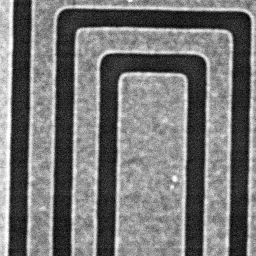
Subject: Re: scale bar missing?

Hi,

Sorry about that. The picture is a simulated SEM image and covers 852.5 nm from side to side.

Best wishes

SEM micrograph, groups of lines, slits or small figures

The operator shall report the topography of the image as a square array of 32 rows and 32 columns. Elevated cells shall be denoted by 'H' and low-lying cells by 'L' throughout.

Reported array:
HLLLHHHHHHHHHHHHHHHHHHHHHHHHHHHH
HLLLHHHLLLLLLLLLLLLLLLLLLLLLLLLH
HLLLHHHLLLLLLLLLLLLLLLLLLLLLLLLL
HLLLHHHLLLLLLLLLLLLLLLLLLLLLLLLL
HLLLHHHLLLHHHHHHHHHHHHHHHHHHHLLL
HLLLHHHLLLHHHHHHHHHHHHHHHHHHHLLL
HLLLHHHLLLHHHHHHHHHHHHHHHHHHHLLL
HLLLHHHLLLHHHLLLLLLLLLLLLLHHHLLL
HLLLHHHLLLHHLLLLLLLLLLLLLLHHHLLL
HLLLHHHLLHHHLLLHHHHHHHHLLLHHHLLL
HLLLHHHLLHHHLLLHHHHHHHHLLLHHHLLL
HLLLHHHLLHHHLLLHHHHHHHHLLLHHHLLL
HLLLHHHLLHHHLLLHHHHHHHHLLLHHHLLH
HLLLHHHLLHHHLLLHHHHHHHHLLLHHHLLH
HLLLHHHLLHHHLLLHHHHHHHHLLLHHHLLH
HLLLHHHLLHHHLLLHHHHHHHHLLLHHHLLH
HLLLHHHLLHHHLLLHHHHHHHHLLLHHHLLH
HLLLHHHLLHHHLLLHHHHHHHHLLLHHHLLH
HLLLHHHLLHHHLLLHHHHHHHHLLLHHHLLH
HLLLHHHLLHHHLLLHHHHHHHHLLLHHHLLH
HLLLHHHLLHHHLLLHHHHHHHHLLLHHHLLH
HLLLHHHLLHHHLLLHHHHHHHHLLLHHHLLH
HLLLHHHLLHHHLLLHHHHHHHHLLLHHHLLH
HLLLHHHLLHHHLLLHHHHHHHHLLLHHHLLH
HLLLHHHLLHHHLLLHHHHHHHHLLLHHHLLH
HLLLHHLLLHHHLLLHHHHHHHHLLLHHHLLH
HLLLHHLLLHHHLLLHHHHHHHHLLLHHHLLH
HLLLHHLLLHHHLLLHHHHHHHHLLLHHHLLH
HLLLHHLLLHHHLLLHHHHHHHHLLLHHLLLH
HLLLHHLLLHHHLLLHHHHHHHHLLLHHLLLH
HLLLHHLLLHHHLLLHHHHHHHHLLLHHLLLH
HLLLHHLLLHHHLLLHHHHHHHHLLLHHLLLH